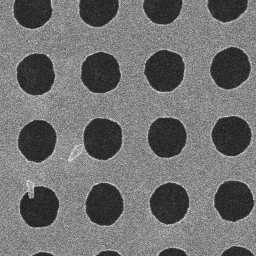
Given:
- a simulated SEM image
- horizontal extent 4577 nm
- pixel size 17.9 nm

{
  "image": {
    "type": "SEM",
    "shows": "a regular array of holes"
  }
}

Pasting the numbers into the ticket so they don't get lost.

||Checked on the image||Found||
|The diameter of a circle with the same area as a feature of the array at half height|722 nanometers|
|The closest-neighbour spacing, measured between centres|1150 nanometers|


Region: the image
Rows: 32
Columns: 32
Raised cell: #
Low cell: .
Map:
##....####.....###.....###.....#
##.....###.....###.....###....##
##....####....#####...#####..###
###..###########################
################################
################################
####################..#####....#
###...#####....###.....####....#
##.....###.....###.....###.....#
##.....###.....###.....###.....#
##.....###.....####...#####...##
###...######.#######.###########
################################
################################
################################
###...#####....####....####....#
###....###.....####....###.....#
##.....###.....###.....####....#
##.....####....####....####....#
###...#####...######..######.###
################################
################################
################################
####..######..######...####....#
###....####....####.....###.....
##.....####....####.....###.....
###....####....####....####....#
###....####....#####..######..##
################################
################################
################################
#############..#####...#####...#